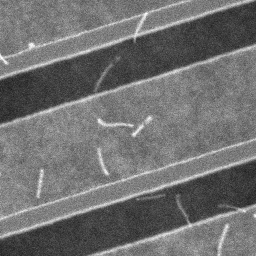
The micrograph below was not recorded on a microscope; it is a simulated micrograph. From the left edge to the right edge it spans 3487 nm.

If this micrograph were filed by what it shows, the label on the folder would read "lines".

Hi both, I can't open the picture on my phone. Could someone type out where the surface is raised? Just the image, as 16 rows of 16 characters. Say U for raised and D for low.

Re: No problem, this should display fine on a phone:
UUUUUUUUUUUUUUDD
UUUUUUUUUUUDDDDD
UUUUUUUDDDDDDDDD
UUUUDDDDDDDDDDUU
UDDDDDDDDDDUUUUU
DDDDDDDDUUUUUUUU
DDDDUUUUUUUUUUUU
DUUUUUUUUUUUUUUU
UUUUUUUUUUUUUUUU
UUUUUUUUUUUUUUUU
UUUUUUUUUUUUUUDD
UUUUUUUUUUUDDDDD
UUUUUUUUDDDDDDDD
UUUUDDDDDDDDDDUU
UDDDDDDDDDDUUUUU
DDDDDDDDUUUUUUUU